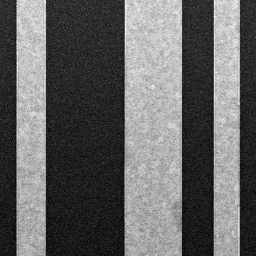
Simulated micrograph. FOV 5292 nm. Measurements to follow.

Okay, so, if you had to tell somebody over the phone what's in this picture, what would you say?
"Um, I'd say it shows groups of lines, slits or small figures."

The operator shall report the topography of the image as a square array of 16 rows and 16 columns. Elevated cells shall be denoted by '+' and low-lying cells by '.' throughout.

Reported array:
.++.....+++..++.
.++.....+++..++.
.++.....+++..++.
.++.....+++..++.
.++.....+++..++.
.++.....+++..++.
.++.....+++..++.
.++.....+++..++.
.++.....+++..++.
.++.....+++..++.
.++.....+++..++.
.++.....+++..++.
.++.....+++..++.
.++.....+++..++.
.++.....+++..++.
.++.....+++..++.